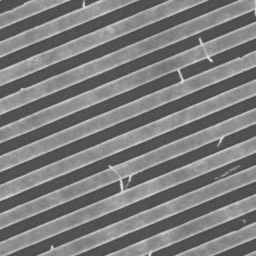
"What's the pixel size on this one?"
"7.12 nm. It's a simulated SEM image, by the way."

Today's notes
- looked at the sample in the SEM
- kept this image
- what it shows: parallel lines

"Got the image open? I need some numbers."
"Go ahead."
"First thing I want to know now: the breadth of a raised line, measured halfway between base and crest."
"0.103 micrometres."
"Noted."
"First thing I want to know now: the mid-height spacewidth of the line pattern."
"81.4 nanometres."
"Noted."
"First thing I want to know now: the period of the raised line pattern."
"188 nanometers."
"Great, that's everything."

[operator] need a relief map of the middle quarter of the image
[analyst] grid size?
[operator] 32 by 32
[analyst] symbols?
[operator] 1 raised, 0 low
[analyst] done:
00001111111110000000001111111110
00111111111000000001111111111000
11111111000000001111111111000000
11111100000000111111111100000001
11110000000011111111100000000111
10000000011111111110000000111111
00000001111111110000000011111111
00000111111111000000001111111110
00111111111000000001111111111000
11111111100000000111111111100000
11111110000000111111111100000000
11110000000011111111110000000111
11000000011111111110000000011111
00000001111111111000000001111111
00000111111111000000001111111111
00111111111100000000111111111000
11111111110000000111111111100000
11111110000000011111111100000000
11110000000011111111110000000011
11000000001111111111000000001111
00000000111111111000000001111111
00000111111111100000000111111111
00011111111110000000111111111000
11111111110000000011111111100000
11111110000000011111111110000000
11111000000001111111110000000001
11100000000111111111000000011111
10000000111111111100000000111111
00000011111111100000000111111111
00011111111110000000011111111100
01111111110000000011111111110000
11111111000000001111111110000000